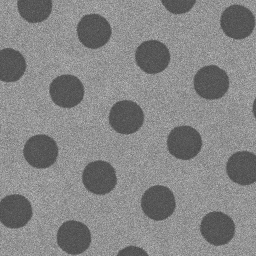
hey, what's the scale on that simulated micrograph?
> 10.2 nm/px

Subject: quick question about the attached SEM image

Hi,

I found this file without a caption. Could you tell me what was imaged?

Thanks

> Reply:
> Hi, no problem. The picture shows a regular array of holes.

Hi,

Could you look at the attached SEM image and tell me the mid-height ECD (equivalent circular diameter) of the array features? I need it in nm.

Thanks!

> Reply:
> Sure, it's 354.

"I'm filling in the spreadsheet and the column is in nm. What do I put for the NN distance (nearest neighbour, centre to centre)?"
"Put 655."